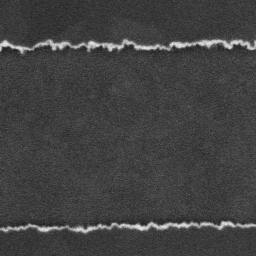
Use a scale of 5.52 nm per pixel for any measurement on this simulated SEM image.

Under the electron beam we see one or a few lines or trenches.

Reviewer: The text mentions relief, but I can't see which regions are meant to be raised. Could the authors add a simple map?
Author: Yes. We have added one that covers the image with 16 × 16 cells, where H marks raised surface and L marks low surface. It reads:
HHHHHHHHHHHHHHHH
HHHHHHHHHHHHHHHH
HHHHHHHHHHHHHHHH
LLLLLLLLLLLLLLLL
LLLLLLLLLLLLLLLL
LLLLLLLLLLLLLLLL
LLLLLLLLLLLLLLLL
LLLLLLLLLLLLLLLL
LLLLLLLLLLLLLLLL
LLLLLLLLLLLLLLLL
LLLLLLLLLLLLLLLL
LLLLLLLLLLLLLLLL
LLLLLLLLLLLLLLLL
LLLLLLLLLLLLLLLL
HHHHHHHHHHHHHHHH
HHHHHHHHHHHHHHHH